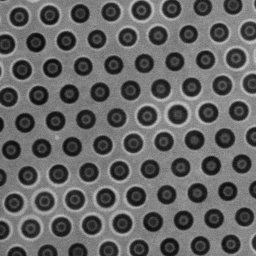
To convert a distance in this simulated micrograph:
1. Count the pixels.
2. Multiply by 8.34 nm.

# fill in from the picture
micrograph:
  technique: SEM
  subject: an array of small figures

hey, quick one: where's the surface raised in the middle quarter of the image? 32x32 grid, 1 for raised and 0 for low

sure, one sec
11000001110000011100001110000011
11100001110000011100001111000111
11100011111001111111111111111111
11111111111111111111111111111110
11111111111111100011110000111100
00011110000111000001110000011000
00001100000111000001110000011000
00001110000011000001110000011100
00001110000111100011111000111110
00011111101111111111111111111111
11111111111111111111001111000001
11110011111100011100000111000001
11100000111000001100000010000000
11100000111000001100000011000001
01100000111000001100000111000001
11110001111100011110001111110111
11111111111111111111111111111110
11111111111111110001111000011100
10011111000011100000111000011100
00001110000011100000110000001100
00000110000011100000111000011110
00001110000011100001111000111111
00001111000111111011111111111111
11111111111111111111111111110011
11111111111100011111000111100001
11110000111100001110000011100000
01110000011000000110000011100000
01110000011000000110000011100001
01110000011100001111000111111111
01111001111111111111111111111111
11111111111111111001111110011110
10001111100011110000111100001110